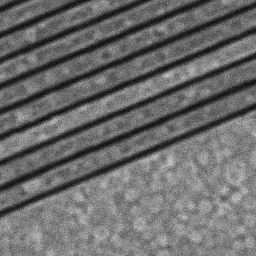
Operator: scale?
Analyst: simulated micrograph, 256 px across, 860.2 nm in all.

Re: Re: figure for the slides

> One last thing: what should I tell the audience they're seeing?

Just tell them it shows parallel lines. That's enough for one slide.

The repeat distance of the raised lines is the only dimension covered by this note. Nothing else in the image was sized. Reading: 79.1 nm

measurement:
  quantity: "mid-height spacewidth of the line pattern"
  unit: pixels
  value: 6.82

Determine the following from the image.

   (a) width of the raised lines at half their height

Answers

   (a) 53.9 nm